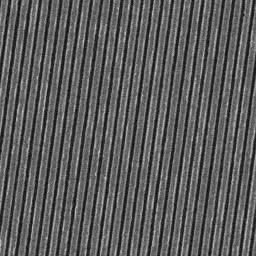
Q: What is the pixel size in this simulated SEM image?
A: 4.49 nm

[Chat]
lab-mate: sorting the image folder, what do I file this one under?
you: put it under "parallel lines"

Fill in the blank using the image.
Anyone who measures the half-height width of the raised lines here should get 0.0267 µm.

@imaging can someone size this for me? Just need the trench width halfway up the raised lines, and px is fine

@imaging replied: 3.96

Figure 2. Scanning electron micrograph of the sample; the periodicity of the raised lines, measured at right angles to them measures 0.0452 µm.